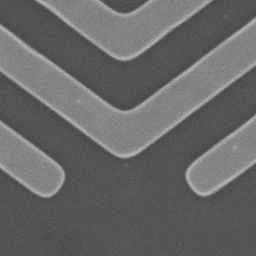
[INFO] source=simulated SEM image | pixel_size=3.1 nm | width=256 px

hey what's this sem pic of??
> groups of lines, slits or small figures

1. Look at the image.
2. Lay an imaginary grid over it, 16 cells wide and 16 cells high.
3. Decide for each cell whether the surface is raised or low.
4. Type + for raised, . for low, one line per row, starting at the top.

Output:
...++++..++++...
....+++++++.....
+.....++++....++
+++....+.....+++
++++........+++.
.++++.....++++..
...++++..++++...
....+++++++.....
+.....++++....++
+++....++....+++
++++........+++.
.+++........++..
................
................
................
................